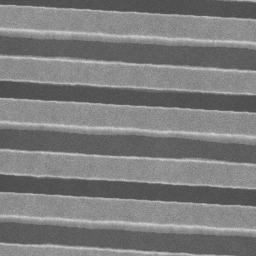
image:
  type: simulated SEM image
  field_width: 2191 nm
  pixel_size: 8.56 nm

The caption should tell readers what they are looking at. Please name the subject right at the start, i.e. lines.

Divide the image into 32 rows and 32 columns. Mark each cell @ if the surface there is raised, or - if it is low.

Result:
--------------------------------
@@@@@@@@@@@@@@@-----------------
@@@@@@@@@@@@@@@@@@@@@@@@@@@@@@@@
@@@@@@@@@@@@@@@@@@@@@@@@@@@@@@@@
----------@@@@@@@@@@@@@@@@@@@@@@
----------------------------@@@@
--------------------------------
@@@@@@@@@@@---------------------
@@@@@@@@@@@@@@@@@@@@@@@@@-------
@@@@@@@@@@@@@@@@@@@@@@@@@@@@@@@@
-------@@@@@@@@@@@@@@@@@@@@@@@@@
--------------------------@@@@@@
@@@@----------------------------
@@@@@@@@@@@@@@@@@@@@@-----------
@@@@@@@@@@@@@@@@@@@@@@@@@@@@@@@@
@@@@@@@@@@@@@@@@@@@@@@@@@@@@@@@@
-----------------@@@@@@@@@@@@@@@
-------------------------------@
--------------------------------
@@@@@@@@@@@@@-------------------
@@@@@@@@@@@@@@@@@@@@@@@@@@@@@@--
@@@@@@@@@@@@@@@@@@@@@@@@@@@@@@@@
------------@@@@@@@@@@@@@@@@@@@@
------------------------------@@
@@@@@@@@------------------------
@@@@@@@@@@@@@@@@@@@@@@@@@@------
@@@@@@@@@@@@@@@@@@@@@@@@@@@@@@@@
----@@@@@@@@@@@@@@@@@@@@@@@@@@@@
-------------------@@@@@@@@@@@@@
--------------------------------
@@------------------------------
@@@@@@@@@@@@@@@@@@--------------